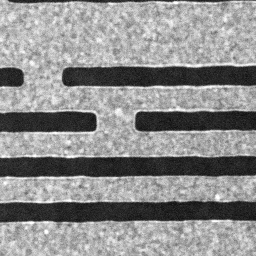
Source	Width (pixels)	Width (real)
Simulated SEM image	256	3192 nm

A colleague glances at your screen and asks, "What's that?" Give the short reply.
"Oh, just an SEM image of groups of lines, slits or small figures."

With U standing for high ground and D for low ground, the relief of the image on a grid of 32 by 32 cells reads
UUUDUUUUUUUUUUUUUUUUUUUUUUUUUUUU
UUUUUUUUUUUUUUUUUUUUUUUUUUUUUUUU
UUUUUUUUUUUUUUUUUUUUUUUUUUUUUUUU
UUUUUUUUUUUUUUUUUUUUUUUUUUUUUUUU
UUUUUUUUUUUUUUUUUUUUUUUUUUUUUUUU
UUUUUUUUUUUUUUUUUUUUUUUUUUUUUUUU
UUUUUUUUUUUUUUUUUUUUUUUUUUUUUUUU
UUUUUUUUUUUUUUUUUUUUUUUUUUUUUUUU
DDUUUUUUDDDDDDDDDDDDDDDDDDDDDDDD
DDDUUUUUDDDDDDDDDDDDDDDDDDDDDDDD
DDDUUUUUDDDDDDDDDDDDDDDDDDDDDDDD
UUUUUUUUUUUUUUUUUUUUUUUUUUUUUUUU
UUUUUUUUUUUUUUUUUUUUUUUUUUUUUUUU
UUUUUUUUUUUUUUUUUUUUUUUUUUUUUUUU
DDDDDDDDDDDDUUUUUDDDDDDDDDDDDDDD
DDDDDDDDDDDDUUUUUDDDDDDDDDDDDDDD
DDDDDDDDDDDDUUUUUUDDDDDDDDUUUUUU
UUUUUUUUUUUUUUUUUUUUUUUUUUUUUUUU
UUUUUUUUUUUUUUUUUUUUUUUUUUUUUUUU
UUUDDDDDUUDDDDDDDDDDDDDDDUUDDDDD
DDDDDDDDDDDDDDDDDDDDDDDDDDDDDDDD
DDDDDDDDDDDDDDDDDDDDDDDDDDDDDDDD
UUUUUUUUUUUUUUUUUUUUUUUUUUUUUUUU
UUUUUUUUUUUUUUUUUUUUUUUUUUUUUUUU
UUUUUUUUUUUUUUUUUUUUUUUUUUUUUUUU
DDDDDDDDDDDDDDDDDDDDDDDDDDDDDDDD
DDDDDDDDDDDDDDDDDDDDDDDDDDDDDDDD
DDDDDDDDDDDDDDDDDDDDDDDDDDDDDDDD
UUUUUUUUUUUUUUUUUUUUUUUUUUUUUUUU
UUUUUUUUUUUUUUUUUUUUUUUUUUUUUUUU
UUUUUUUUUUUUUUUUUUUUUUUUUUUUUUUU
UUUUUUUUUUUUUUUUUUUUUUUUUUUUUUUU